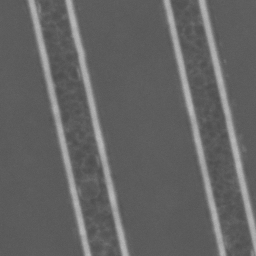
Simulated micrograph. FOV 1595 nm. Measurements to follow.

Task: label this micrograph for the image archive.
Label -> one or a few lines or trenches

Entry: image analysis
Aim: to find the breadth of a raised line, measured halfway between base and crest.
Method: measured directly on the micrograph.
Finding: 228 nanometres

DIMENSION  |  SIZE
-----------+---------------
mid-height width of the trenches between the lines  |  590 nm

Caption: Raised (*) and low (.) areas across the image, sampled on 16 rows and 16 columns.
..**.......**...
..***......**...
..***......**...
...**......**...
...**......***..
...***......**..
...***......**..
....**......**..
....**......***.
....**.......**.
....***......**.
....***......**.
.....**......**.
.....**......***
.....***......**
.....***......**